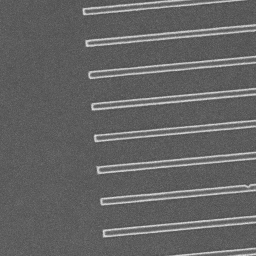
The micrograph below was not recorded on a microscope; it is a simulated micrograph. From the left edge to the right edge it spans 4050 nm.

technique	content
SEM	parallel lines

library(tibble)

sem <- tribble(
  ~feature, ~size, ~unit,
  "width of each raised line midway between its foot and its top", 90.6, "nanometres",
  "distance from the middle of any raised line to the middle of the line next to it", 31.8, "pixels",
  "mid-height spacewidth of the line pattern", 25.5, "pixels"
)